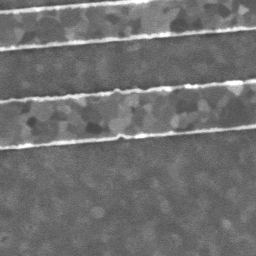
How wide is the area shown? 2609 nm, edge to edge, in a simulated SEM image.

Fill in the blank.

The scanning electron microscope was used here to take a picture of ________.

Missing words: one or a few lines or trenches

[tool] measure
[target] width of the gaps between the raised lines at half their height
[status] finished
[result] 523 nanometres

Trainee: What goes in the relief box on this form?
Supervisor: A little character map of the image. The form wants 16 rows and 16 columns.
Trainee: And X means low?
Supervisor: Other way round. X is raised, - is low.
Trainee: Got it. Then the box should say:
--XXXXXXXXXXXXXX
XXXXXXXXXXXXXXXX
XXXXXXX---------
----------------
----------------
----------XXXXXX
XXXXXXXXXXXXXXXX
XXXXXXXXXXXXXXXX
XXXXXXXXX-------
----------------
----------------
----------------
----------------
----------------
----------------
----------------